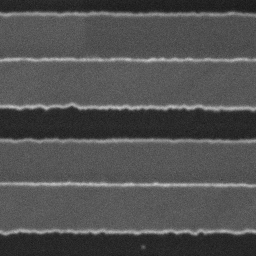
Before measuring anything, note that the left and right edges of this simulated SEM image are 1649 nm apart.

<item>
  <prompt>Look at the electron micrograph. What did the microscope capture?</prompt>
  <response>lines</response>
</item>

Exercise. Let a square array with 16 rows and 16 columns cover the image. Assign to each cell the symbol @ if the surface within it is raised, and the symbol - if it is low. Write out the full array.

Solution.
----------------
@@@@@@@@@@@@@@@@
@@@@@@@@@@@@@@@@
@@@@@@@@@@@@@@@@
@@@@@@@@@@@@@@@@
@@@@@@@@@@@@@@@@
@@@@@@@@@@@@@@@@
----------------
----------------
@@@@@@@@@@@@@@@@
@@@@@@@@@@@@@@@@
@@@@@@@@@@@@@@@@
@@@@@@@@@@@@@@@@
@@@@@@@@@@@@@@@@
@-@-@@@@@@@@@@@@
----------------